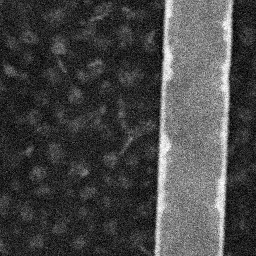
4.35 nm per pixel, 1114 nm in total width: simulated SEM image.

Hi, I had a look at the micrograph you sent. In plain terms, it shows one or a few lines or trenches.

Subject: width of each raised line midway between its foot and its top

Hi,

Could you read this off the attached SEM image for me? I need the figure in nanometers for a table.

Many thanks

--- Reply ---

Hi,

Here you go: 274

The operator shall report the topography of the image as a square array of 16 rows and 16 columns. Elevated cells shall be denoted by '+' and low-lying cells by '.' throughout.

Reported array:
..........++++..
..........++++..
..........++++..
..........++++..
..........++++..
..........++++..
..........++++..
..........++++..
..........++++..
..........++++..
..........++++..
..........++++..
..........++++..
..........++++..
..........++++..
..........++++..